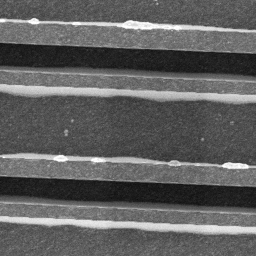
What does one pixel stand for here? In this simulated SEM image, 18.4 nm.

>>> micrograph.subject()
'lines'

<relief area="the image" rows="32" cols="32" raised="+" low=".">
................................
................................
+...+...........................
+++++++++++++++++++++++.........
++++++++++++++++++++++++++++++++
......++++++++++++++++++++++++++
..............................++
................................
................................
++++++++++++++++++..............
++++++++++++++++++++++++++++++++
................++++++++++++++++
................................
................................
................................
................................
................................
................................
................................
.......+........................
+++++++++++++++++++++++.....++..
++++++++++++++++++++++++++++++++
.............+++++++++++++++++++
................................
................................
+++++++.........................
++++++++++++++++++++++++++++++..
.......+++++++++++++++++++++++++
..............................++
................................
................................
................................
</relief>